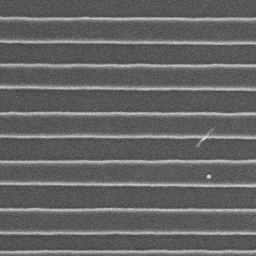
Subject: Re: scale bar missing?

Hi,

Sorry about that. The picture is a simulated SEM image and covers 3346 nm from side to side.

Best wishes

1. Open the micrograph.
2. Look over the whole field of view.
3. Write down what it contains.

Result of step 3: lines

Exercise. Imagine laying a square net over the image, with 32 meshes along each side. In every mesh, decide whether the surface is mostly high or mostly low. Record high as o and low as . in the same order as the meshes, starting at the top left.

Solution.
................................
................................
oooooooooooooooooooooooooooooooo
oooooooooooooooooooooooooooooooo
oooooooooooooooooooooooooooooooo
................................
................................
................................
oooooooooooooooooooooooooooooooo
oooooooooooooooooooooooooooooooo
oooooooooooooooooooooooooooooooo
................................
................................
................................
oooooooooooooooooooooooooooooooo
oooooooooooooooooooooooooooooooo
oooooooooooooooooooooooooooooooo
................................
................................
................................
oooooooooooooooooooooooooooooooo
oooooooooooooooooooooooooooooooo
oooooooooooooooooooooooooooooooo
................................
................................
................................
oooooooooooooooooooooooooooooooo
oooooooooooooooooooooooooooooooo
oooooooooooooooooooooooooooooooo
................................
................................
oooooooooooooooooooooooooooooooo